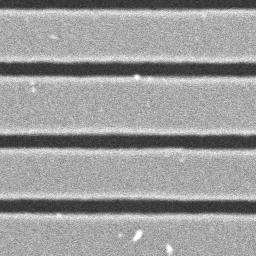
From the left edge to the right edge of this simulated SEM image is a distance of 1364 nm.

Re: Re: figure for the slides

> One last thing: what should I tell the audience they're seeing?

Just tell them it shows lines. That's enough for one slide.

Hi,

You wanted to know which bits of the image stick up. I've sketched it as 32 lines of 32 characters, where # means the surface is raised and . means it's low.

................................
################################
################################
################################
################################
################################
################################
################################
................................
................................
################################
################################
################################
################################
################################
################################
################################
................................
................................
################################
################################
################################
################################
################################
################################
................................
................................
################################
################################
################################
################################
################################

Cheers